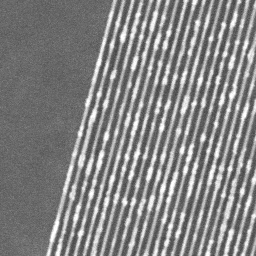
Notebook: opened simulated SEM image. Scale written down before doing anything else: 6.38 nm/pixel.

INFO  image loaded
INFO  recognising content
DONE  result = parallel lines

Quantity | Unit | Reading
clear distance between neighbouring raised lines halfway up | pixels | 5.31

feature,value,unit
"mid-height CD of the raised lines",17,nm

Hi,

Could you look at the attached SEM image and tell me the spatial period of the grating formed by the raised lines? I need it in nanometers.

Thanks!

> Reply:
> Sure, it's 54.7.